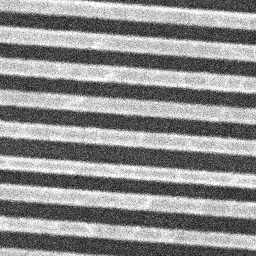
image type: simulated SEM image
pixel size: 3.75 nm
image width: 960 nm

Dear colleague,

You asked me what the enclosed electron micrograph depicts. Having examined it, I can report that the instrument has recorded parallel lines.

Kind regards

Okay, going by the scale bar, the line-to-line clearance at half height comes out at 65.9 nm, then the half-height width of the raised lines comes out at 0.0509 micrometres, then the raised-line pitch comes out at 0.118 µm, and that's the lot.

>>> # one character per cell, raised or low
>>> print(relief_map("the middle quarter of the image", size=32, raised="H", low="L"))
HHHHHLLHLLLLLLLLLLLLLLLLLLLLLLLL
HHHHHHHHHHHHHHHHHHHHHLLLLLLLLLLL
HHHHHHHHHHHHHHHHHHHHHHHHHHHHHHHH
LHHHHHHHHHHHHHHHHHHHHHHHHHHHHHHH
LLLLLLLLLLLLLLLLHHHHHHHHHHHHHHHH
LLLLLLLLLLLLLLLLLLLLLLLLLLLLLHHH
LLLLLLLLLLLLLLLLLLLLLLLLLLLLLLLL
LLLLLLLLLLLLLLLLLLLLLLLLLLLLLLLL
HHHHHHHLLLLLLLLLLLLLLLLLLLLLLLLL
HHHHHHHHHHHHHHHHHHHHLHLLLLLLLLLL
HHHHHHHHHHHHHHHHHHHHHHHHHHHHHHHH
LLLLHHHHHHHHHHHHHHHHHHHHHHHHHHHH
LLLLLLLLLLLLLLLLLLHHHHHHHHHHHHHH
LLLLLLLLLLLLLLLLLLLLLLLLLLLLLLHH
LLLLLLLLLLLLLLLLLLLLLLLLLLLLLLLL
LLLLLLLLLLLLLLLLLLLLLLLLLLLLLLLL
HHHHHHHHHLLLLLLLLLLLLLLLLLLLLLLL
HHHHHHHHHHHHHHHHHHHLHHHLLLLLLLLL
HHHHHHHHHHHHHHHHHHHHHHHHHHHHHHHH
LLLLLLHHHHHHHHHHHHHHHHHHHHHHHHHH
LLLLLLLLLLLLLLLLLLLLHHHHHHHHHHHH
LLLLLLLLLLLLLLLLLLLLLLLLLLLLLLLL
LLLLLLLLLLLLLLLLLLLLLLLLLLLLLLLL
LLLLLLLLLLLLLLLLLLLLLLLLLLLLLLLL
LLLLLLLLLLLLLLLLLLLLLLLLLLLLLLLL
HHHHHHHHHHHHLLLLLLLLLLLLLLLLLLLL
HHHHHHHHHHHHHHHHHHHHHHHHHHLLLLLL
LLLLLLHHHHHHHHHHHHHHHHHHHHHHHHHH
LLLLLLLLLLLLLLLLLLLHHHHHHHHHHHHH
LLLLLLLLLLLLLLLLLLLLLLLLLLLLLLLL
LLLLLLLLLLLLLLLLLLLLLLLLLLLLLLLL
LLLLLLLLLLLLLLLLLLLLLLLLLLLLLLLL